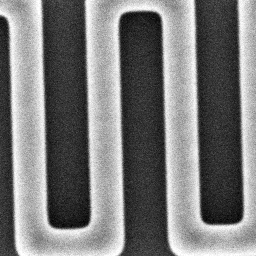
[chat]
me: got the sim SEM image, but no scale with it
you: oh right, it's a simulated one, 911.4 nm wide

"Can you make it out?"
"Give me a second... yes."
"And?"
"groups of lines, slits or small figures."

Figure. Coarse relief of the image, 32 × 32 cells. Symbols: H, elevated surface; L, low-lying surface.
HHHHHLLLLLLHHHHHHHHHHHHHLLLLLLHH
HHHHHLLLLLLHHHHHLLLLHHHHLLLLLLHH
LHHHHLLLLLLHHHHLLLLLHHHHLLLLLLHH
LHHHHLLLLLLHHHHLLLLLHHHHLLLLLLHH
LHHHHLLLLLLHHHHLLLLLHHHHLLLLLLHH
LHHHHLLLLLLHHHHLLLLLHHHHLLLLLLHH
LHHHHLLLLLLHHHHLLLLLHHHHLLLLLLHH
LHHHHLLLLLLHHHHLLLLLLHHHLLLLLLHH
LHHHHLLLLLLHHHHLLLLLLHHHLLLLLLHH
LHHHHLLLLLLHHHHLLLLLLHHHLLLLLLHH
LHHHHLLLLLLHHHHLLLLLLHHHHLLLLLHH
LHHHHLLLLLLHHHHLLLLLLHHHHLLLLLHH
LLHHHLLLLLLHHHHLLLLLLHHHHLLLLLHH
LLHHHLLLLLLHHHHLLLLLLHHHHLLLLLHH
LLHHHHLLLLLHHHHLLLLLLHHHHLLLLLHH
LLHHHHLLLLLHHHHLLLLLLHHHHLLLLLHH
LLHHHHLLLLLHHHHLLLLLLHHHHLLLLLHH
LLHHHHLLLLLHHHHLLLLLLHHHHLLLLLHH
LLHHHHLLLLLHHHHLLLLLLHHHHLLLLLHH
LLHHHHLLLLLHHHHLLLLLLHHHHLLLLLHH
LLHHHHLLLLLHHHHLLLLLLHHHHLLLLLHH
LLHHHHLLLLLHHHHLLLLLLHHHHLLLLLHH
LLHHHHLLLLLHHHHLLLLLLHHHHLLLLLHH
LLHHHHLLLLLHHHHLLLLLLHHHHLLLLLHH
LLHHHHLLLLLHHHHLLLLLLHHHHLLLLLLH
LLHHHHLLLLLHHHHLLLLLLHHHHLLLLLLH
LLHHHHLLLLLLHHHLLLLLLHHHHLLLLLLH
LLHHHHLLLLLHHHHLLLLLLHHHHLLLLLHH
LLHHHHHLLLLHHHHLLLLLLHHHHHHHHHHH
LLHHHHHHHHHHHHHLLLLLLHHHHHHHHHHH
LLHHHHHHHHHHHHHLLLLLLHHHHHHHHHHH
LLHHHHHHHHHHHHHLLLLLLLHHHHHHHHHH